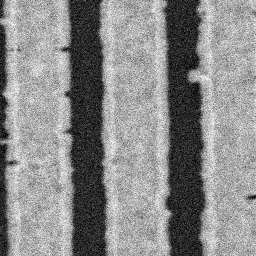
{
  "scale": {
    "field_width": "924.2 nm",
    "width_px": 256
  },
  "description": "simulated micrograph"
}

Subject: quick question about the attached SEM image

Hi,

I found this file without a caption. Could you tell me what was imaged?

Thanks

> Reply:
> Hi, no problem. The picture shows one or a few lines or trenches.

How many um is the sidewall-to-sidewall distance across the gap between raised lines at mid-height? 0.158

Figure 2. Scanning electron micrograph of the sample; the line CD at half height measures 194 nm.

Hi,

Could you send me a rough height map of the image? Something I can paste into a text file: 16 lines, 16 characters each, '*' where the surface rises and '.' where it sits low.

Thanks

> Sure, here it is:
.***...***...***
.***...***...***
.***...***...***
.***...***...***
.***...***...***
.***...***...***
.***...***...***
.***...***...***
.***...***...***
.***...***...***
.***...***...***
.***...***...***
.***...***...***
.***...***...***
.***...***...***
.***...***...***